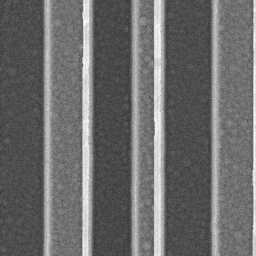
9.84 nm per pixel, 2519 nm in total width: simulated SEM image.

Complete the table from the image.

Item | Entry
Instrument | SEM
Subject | lines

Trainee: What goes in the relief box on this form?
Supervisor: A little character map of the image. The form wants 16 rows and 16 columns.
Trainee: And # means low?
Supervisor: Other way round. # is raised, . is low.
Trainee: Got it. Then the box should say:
...###..##....##
...###..##....##
...###..##....##
...###..##....##
...###..##....##
...###..##....##
...###..##...###
...###..##...###
...###..##....##
...###..##....##
...###..##...###
...###..##...###
...###..##...###
...###..##...###
...###..##...###
...###..##...###